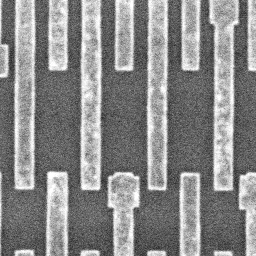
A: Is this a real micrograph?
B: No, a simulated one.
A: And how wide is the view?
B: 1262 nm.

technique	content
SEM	wiring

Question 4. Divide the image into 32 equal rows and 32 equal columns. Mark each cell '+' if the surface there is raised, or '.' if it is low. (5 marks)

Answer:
..++..++..++...++..++..++.++++.+
..++..++..++...++..++..++.++++.+
..++..++..++...++..++..++.++++.+
..++..++..++...++..++..++..++..+
..++..++..++...++..++..++..++..+
..++..++..++...++..++..++..++..+
+.++..++..++...++..++..++..++..+
+.++..++..++...++..++..++..++..+
+.++..++..++...+...++..++..++..+
..++......++.......++......++...
..++......++.......++......++...
..++......++.......++......++...
..++......++.......++......++...
..++......++.......++......++...
..++......++.......++......++...
..++......++.......++......++...
..++......++.......++......++...
..++......++.......++......++...
..++......++.......++......++...
..++......++.......++......++...
..++......++.......++......++...
..++......++.......++......++...
..++..++..++..+++..++..++..++.++
..++..++..++..+++..++..++..++.++
......++......+++......++.....++
......++......+++......++.....++
......++......+++......++......+
......++......+++......++......+
......++......+++......++......+
......++......+++......++......+
......++......+++......++......+
..++..++..++..+++..+...++......+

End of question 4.